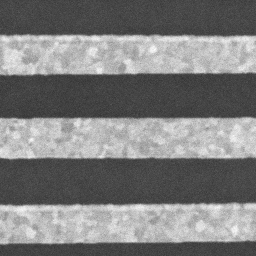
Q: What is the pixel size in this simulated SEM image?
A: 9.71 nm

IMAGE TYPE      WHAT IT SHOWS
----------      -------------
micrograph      lines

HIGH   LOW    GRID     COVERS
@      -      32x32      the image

--------------------------------
--------------------------------
--------------------------------
--------------------------------
---@----------------------------
@@@@@@@@@@@@@@@@@@@@@@@@@@@@@@@@
@@@@@@@@@@@@@@@@@@@@@@@@@@@@@@@@
@@@@@@@@@@@@@@@@@@@@@@@@@@@@@@@@
@@@@@@@@@@@@@@@@@@@@@@@@@@@@@@@@
--------------------------------
--------------------------------
--------------------------------
--------------------------------
--------------------------------
--------------------------------
@@@@@@@@@@@@@@@@@@@@@@@@@@@@@@@@
@@@@@@@@@@@@@@@@@@@@@@@@@@@@@@@@
@@@@@@@@@@@@@@@@@@@@@@@@@@@@@@@@
@@@@@@@@@@@@@@@@@@@@@@@@@@@@@@@@
@@@@@@@@@@@@@@@@@@@@@@@@@@@@@@@@
--------------------------------
--------------------------------
--------------------------------
--------------------------------
--------------------------------
--------------------------------
@@@@@@@@@@@@@@@@@@@@@@@@@@@@@@@@
@@@@@@@@@@@@@@@@@@@@@@@@@@@@@@@@
@@@@@@@@@@@@@@@@@@@@@@@@@@@@@@@@
@@@@@@@@@@@@@@@@@@@@@@@@@@@@@@@@
--------------------------------
--------------------------------